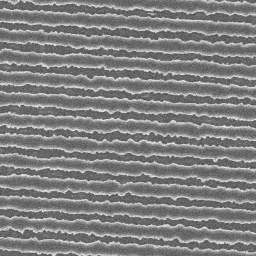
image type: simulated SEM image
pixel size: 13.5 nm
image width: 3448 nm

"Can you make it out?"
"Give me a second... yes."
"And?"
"parallel lines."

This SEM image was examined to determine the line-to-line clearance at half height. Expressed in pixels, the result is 6.86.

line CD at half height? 182 nm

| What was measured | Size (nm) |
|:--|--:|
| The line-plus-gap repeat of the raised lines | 279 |